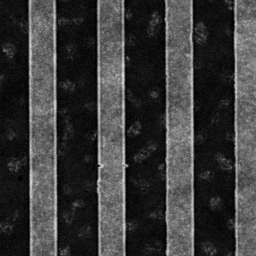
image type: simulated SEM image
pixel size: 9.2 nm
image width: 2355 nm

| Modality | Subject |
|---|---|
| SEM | one or a few lines or trenches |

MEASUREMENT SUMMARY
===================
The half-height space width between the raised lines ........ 408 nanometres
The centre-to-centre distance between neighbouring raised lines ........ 629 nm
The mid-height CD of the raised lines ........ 221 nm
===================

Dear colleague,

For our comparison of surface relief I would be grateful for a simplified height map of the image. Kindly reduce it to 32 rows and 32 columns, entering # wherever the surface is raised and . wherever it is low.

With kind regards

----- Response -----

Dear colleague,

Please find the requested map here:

....###.....###......###.....###
....###.....###......###......##
....###.....###......###......##
....###.....###......###......##
....###.....###......###......##
....###.....###......###......##
....###.....###......###......##
....###.....###......###......##
....###.....###......###......##
....###.....###......###......##
....###.....###......###......##
....###.....###......###......##
....###.....###......###......##
....###.....###......###......##
....###.....###......###......##
....###.....###......###......##
....###.....###......###......##
....###.....###......###......##
....###.....###......###......##
....###.....###......###......##
....###......###.....###......##
....###......##......###......##
....###.....###......###......##
....###.....###......###......##
....###.....###......###......##
....###......##......###......##
....###......##......###......##
....###......##......###......##
....###......##......###......##
....###......##......###......##
....###......##......###......##
....###......##......###......##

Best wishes